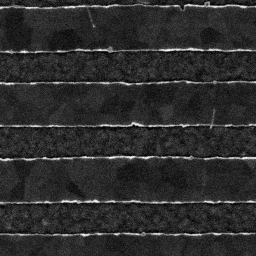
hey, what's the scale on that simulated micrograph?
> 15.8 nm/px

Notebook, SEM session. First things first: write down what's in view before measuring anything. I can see one or a few lines or trenches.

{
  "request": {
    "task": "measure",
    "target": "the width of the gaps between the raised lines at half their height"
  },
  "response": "478 nanometers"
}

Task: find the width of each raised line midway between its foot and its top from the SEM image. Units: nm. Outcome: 707